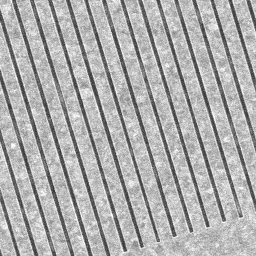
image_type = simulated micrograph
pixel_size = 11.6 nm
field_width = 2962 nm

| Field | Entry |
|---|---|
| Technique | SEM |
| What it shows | parallel lines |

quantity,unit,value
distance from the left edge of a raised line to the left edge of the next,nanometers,200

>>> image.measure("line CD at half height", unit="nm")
147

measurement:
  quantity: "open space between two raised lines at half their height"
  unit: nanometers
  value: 52.6